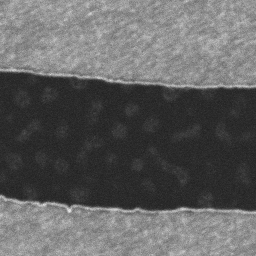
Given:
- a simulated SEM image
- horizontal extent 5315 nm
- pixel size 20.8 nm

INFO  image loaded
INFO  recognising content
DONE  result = one or a few lines or trenches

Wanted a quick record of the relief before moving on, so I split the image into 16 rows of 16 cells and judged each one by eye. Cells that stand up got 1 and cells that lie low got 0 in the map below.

0000000000000000
0000000000000000
0000000000000000
0000000000000000
1100000000000000
1111111111111111
1111111111111111
1111111111111111
1111111111111111
1111111111111111
1111111111111111
1111111111111111
0111111111111111
0000000000000000
0000000000000000
0000000000000000